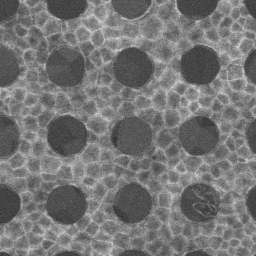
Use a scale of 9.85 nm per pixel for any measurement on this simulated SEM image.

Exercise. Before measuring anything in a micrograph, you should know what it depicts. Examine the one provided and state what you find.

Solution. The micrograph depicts a regular array of raised bodies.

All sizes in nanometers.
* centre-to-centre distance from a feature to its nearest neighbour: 653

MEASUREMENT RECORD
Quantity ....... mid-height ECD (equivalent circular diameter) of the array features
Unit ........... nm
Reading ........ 401